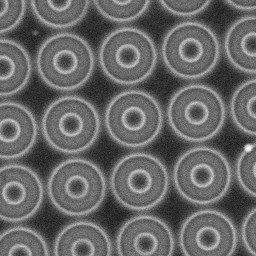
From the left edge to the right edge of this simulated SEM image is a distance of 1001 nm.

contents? an array of small figures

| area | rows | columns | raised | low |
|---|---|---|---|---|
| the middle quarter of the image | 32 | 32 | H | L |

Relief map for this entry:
HHHLLLLHHHLLLLLHHLLLLLHHHHHLLLLL
HHLLLLHHHHHLLLLLLLLLLHHHHHHLLLLL
LLLLLLHHHHHLLLLLLLLLLHHHHHHHHLLL
LLLLLHHHHHHHHLLLLLLHHHHHHHHHHHHH
LLLLHHHHHHHHHHHHHHHHHHHHHHHHHHHH
LLLHHHHHHHHHHHHHHHHHHHHHHHHHHHHH
HHHHHHHHHHHHHHHHHHHHHHHHHHHHHHLL
HHHHHHHHHHHHHHHHLLLHHHHHHHHHHLLL
HHHHHHHHHHHHHHLLLLLLLHHHHHHHLLLL
LLLLLHHHHHHHHLLLLLLLLLHHHHHLLLLL
LLLLLLHHHHHHLLLLLLLLLLLHHHHLLLLH
LLLLLLLHHHHLLLLLHHHLLLLLHHHLLLLH
LHLLLLLLHHHLLLLHHHHHLLLLHHHLLLLH
HHHHLLLLHHHLLLLHHHHHLLLLHHHLLLLH
HHHHLLLLHHHLLLLHHHHHLLLLHHHLLLLL
HHHHLLLLHHHLLLLHHHHHLLLLHHHLLLLL
HHHHLLLLHHHHLLLLLLLLLLLHHHHHLLLL
HHHLLLLLHHHHLLLLLLLLLLLHHHHHHLLL
LLLLLLLHHHHHHLLLLLLLLLHHHHHHHHHL
LLLLLLHHHHHHHHHLLLLLHHHHHHHHHHHH
LLLLLHHHHHHHHHHHHHHHHHHHHHHHHHHH
LLLHHHHHHHHHHHHHHHHHHHHHHHHHHHHH
HHHHHHHHHHHHHHHHHHHHHHHHHHHHHHHL
HHHHHHHHHHHHHHHHLLLLLLHHHHHHHHLL
HHLLHHHHHHHHHHHLLLLLLLLHHHHHHLLL
LLLLLLLHHHHHHHLLLLLLLLLLHHHHHLLL
LLLLLLLLHHHHHLLLLLLLLLLLLHHHLLLL
LLLLLLLLLHHHHLLLLHHHHLLLLHHHLLLL
LLHHHLLLLHHHLLLLHHHHHLLLLHHHLLLL
LHHHHHLLLLHHLLLLHHHHHHLLLHHHLLLL
LHHHHHLLLLHHLLLLLHHHHLLLLHHHHLLL
LHHHHHLLLLHHHLLLLHHHHLLLLHHHHLLL